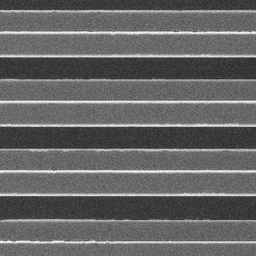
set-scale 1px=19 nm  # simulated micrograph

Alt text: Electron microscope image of lines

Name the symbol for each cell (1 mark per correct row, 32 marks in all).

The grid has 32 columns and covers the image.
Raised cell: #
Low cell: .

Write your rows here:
................................
################################
################################
################################
################################
################################
################################
................................
................................
................................
################################
################################
################################
################################
################################
################################
................................
................................
................................
################################
################################
################################
################################
################################
................................
................................
................................
................................
################################
################################
################################
################################